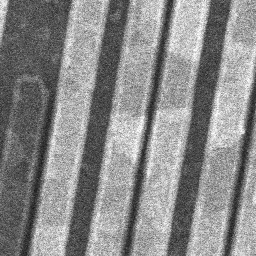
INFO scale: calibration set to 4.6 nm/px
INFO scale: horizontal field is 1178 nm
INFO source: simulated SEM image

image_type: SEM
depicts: parallel lines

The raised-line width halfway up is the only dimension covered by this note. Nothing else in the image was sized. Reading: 140 nm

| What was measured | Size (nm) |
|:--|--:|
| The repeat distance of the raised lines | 234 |